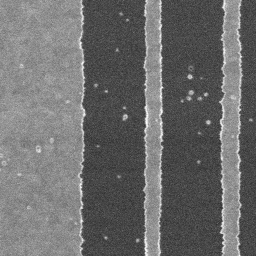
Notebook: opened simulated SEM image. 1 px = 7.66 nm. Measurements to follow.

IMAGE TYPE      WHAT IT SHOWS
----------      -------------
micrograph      one or a few lines or trenches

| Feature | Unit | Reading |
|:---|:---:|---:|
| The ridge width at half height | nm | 123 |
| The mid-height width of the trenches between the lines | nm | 482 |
